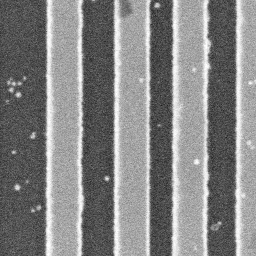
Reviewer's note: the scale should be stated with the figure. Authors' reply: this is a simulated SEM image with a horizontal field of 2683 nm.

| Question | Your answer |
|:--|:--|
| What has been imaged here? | lines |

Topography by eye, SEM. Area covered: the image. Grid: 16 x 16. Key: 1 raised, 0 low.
0001100110011001
0001100110011001
0001100110011001
0001100110011001
0001100110011001
0001100110011001
0001100110011001
0001100110011001
0001100110011001
0001100110011001
0001100110011001
0001100110011001
0001100110011001
0001100110011001
0001100110011001
0001100110011001